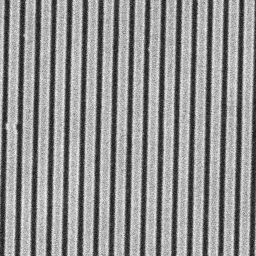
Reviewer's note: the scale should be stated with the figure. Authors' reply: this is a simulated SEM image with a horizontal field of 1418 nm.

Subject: parallel lines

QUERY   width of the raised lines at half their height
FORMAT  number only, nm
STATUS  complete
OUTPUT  49.8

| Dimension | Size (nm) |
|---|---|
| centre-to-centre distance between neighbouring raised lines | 86.6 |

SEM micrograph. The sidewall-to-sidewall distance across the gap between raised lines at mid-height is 0.0346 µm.